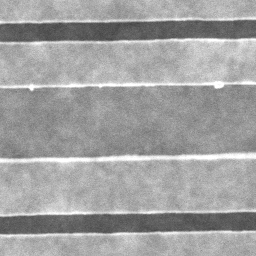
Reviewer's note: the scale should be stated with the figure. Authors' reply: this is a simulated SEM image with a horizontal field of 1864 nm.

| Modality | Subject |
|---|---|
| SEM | lines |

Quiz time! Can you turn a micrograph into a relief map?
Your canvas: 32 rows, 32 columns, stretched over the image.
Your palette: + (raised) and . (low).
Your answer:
++++++++++++++++++++++++++++++++
++++++++++++++++++++++++++++++++
++++++++++++++++++++............
................................
................................
++++++++++++++++++++++++++++++++
++++++++++++++++++++++++++++++++
++++++++++++++++++++++++++++++++
++++++++++++++++++++++++++++++++
++++++++++++++++++++++++++++++++
++++++++++++++++++++++++++++....
................................
................................
................................
................................
................................
................................
................................
................................
................................
++++++++++++++++++++++++++++++++
++++++++++++++++++++++++++++++++
++++++++++++++++++++++++++++++++
++++++++++++++++++++++++++++++++
++++++++++++++++++++++++++++++++
++++++++++++++++++++++++++++++++
+++++++++++++++++++++++++++++...
................................
................................
++++++++++++++++++++++++++++++++
++++++++++++++++++++++++++++++++
++++++++++++++++++++++++++++++++